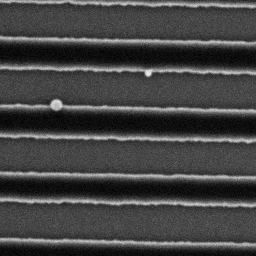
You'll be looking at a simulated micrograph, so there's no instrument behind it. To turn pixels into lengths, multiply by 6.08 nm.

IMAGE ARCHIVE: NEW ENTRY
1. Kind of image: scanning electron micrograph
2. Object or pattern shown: lines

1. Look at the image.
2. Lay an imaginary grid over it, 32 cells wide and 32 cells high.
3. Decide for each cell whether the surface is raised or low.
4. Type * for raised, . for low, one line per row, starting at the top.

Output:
.............*.*.***************
................................
................................
................................
................................
********************************
********************************
********************************
********************************
................................
................................
................................
................................
****************................
********************************
********************************
********************************
......................*..*******
................................
................................
................................
................................
********************************
********************************
********************************
..............*..**..***********
................................
................................
................................
................................
*******************************.
********************************